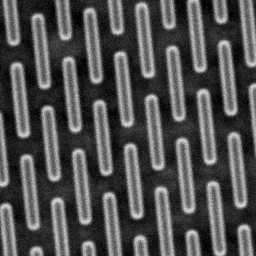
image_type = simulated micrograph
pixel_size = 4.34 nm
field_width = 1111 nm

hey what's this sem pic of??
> groups of lines, slits or small figures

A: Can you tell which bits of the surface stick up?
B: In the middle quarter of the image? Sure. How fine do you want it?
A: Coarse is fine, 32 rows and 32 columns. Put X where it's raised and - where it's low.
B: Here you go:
XXX---XXX----XXX----XX----XXX---
XXX---XXX----XXX----XX----XXX---
XXX----XX----XXX----XX----XXX---
XXX----XX----XXX----------XXX---
XXX----------XXX-----------XX---
XXX-----------XX-----------XX---
-XX-----------XX-----------XX---
-XX-----------XX-----------XXX--
-XX-----------XXX----XX----XXX--
-XXX----XX----XXX----XX----XXX--
-XXX----XX----XXX----XX----XXX--
-XXX----XX----XXX----XX----XXX--
-XXX----XX----XXX----XXX---XXX--
-XXX----XXX----XX----XXX----XX--
-XXX----XXX----XX----XXX--------
-XXX----XXX----------XXX--------
--XX----XXX----------XXX--------
--------XXX----------XXX--------
--------XXX----------XXX--------
--------XXX-----------XX----XXX-
---------XX-----X-----XX----XXX-
---------XX----XXX----XX----XXX-
--XXX----XX----XXX----XXX---XXX-
--XXX----XXX---XXX----XXX----XX-
---XX----XXX----XX----XXX----XX-
---XX----XXX----XX----XXX----XX-
---XX----XXX----XX-----------XXX
---XX-----X-----XXX----------XXX
---XXX----------XXX----------XXX
---XXX----------XXX----------XXX
---XXX----------XXX----------XXX
---XXX----------XXX----XX----XXX